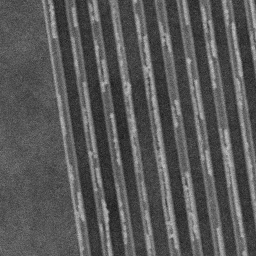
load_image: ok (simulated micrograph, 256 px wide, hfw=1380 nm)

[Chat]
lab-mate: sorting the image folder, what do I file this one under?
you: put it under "parallel lines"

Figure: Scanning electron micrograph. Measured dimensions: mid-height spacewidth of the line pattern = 74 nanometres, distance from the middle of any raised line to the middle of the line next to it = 120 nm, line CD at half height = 49.4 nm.